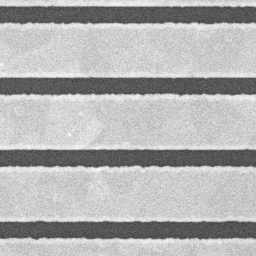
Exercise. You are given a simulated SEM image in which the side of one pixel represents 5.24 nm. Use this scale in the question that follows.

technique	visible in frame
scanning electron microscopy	lines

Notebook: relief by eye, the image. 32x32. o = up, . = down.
oooooooooooooooooooooooooooooooo
................................
................................
oooooooooooooooooooooooooooooooo
oooooooooooooooooooooooooooooooo
oooooooooooooooooooooooooooooooo
oooooooooooooooooooooooooooooooo
oooooooooooooooooooooooooooooooo
oooooooooooooooooooooooooooooooo
ooo.o.o............o.o...o....oo
................................
................................
oooooooooooooooooooooooooooooooo
oooooooooooooooooooooooooooooooo
oooooooooooooooooooooooooooooooo
oooooooooooooooooooooooooooooooo
oooooooooooooooooooooooooooooooo
oooooooooooooooooooooooooooooooo
oooooooooooooooooooooooooooooooo
................................
................................
oooooooooooooooooooooooooooooooo
oooooooooooooooooooooooooooooooo
oooooooooooooooooooooooooooooooo
oooooooooooooooooooooooooooooooo
oooooooooooooooooooooooooooooooo
oooooooooooooooooooooooooooooooo
oooooooooooooooooooooooooooooooo
................................
................................
oooooooooooooooooooooooooooooooo
oooooooooooooooooooooooooooooooo